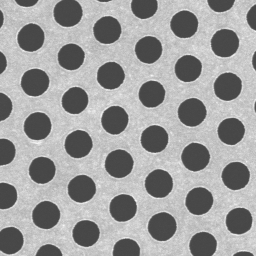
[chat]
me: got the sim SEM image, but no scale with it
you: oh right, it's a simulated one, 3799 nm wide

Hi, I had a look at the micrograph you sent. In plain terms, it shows a regular array of holes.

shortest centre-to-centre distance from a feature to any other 648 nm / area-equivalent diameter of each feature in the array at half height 419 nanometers